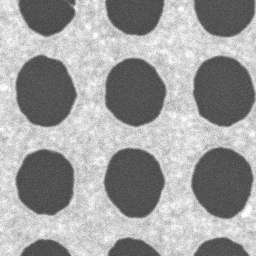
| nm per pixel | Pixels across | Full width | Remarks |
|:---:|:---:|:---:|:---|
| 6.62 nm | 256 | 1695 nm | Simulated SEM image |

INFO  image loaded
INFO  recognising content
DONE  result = holes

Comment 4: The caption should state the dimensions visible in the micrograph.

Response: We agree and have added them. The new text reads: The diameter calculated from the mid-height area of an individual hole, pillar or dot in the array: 65.2 px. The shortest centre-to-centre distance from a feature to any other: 588 nanometers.